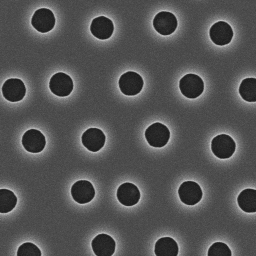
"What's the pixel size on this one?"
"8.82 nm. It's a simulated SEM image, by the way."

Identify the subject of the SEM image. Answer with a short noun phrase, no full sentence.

a regular array of holes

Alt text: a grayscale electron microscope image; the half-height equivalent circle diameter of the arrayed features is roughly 0.214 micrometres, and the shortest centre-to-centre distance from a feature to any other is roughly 501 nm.